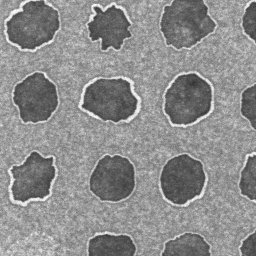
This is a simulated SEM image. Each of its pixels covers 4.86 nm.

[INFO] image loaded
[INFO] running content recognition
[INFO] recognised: holes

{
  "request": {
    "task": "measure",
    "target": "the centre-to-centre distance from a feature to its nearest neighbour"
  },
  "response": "350 nm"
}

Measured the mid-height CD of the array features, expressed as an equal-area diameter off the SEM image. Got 228 nm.